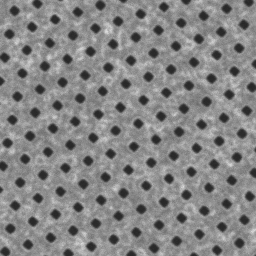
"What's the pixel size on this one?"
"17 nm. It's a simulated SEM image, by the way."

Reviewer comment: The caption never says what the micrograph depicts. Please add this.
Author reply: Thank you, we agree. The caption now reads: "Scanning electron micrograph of a regular array of holes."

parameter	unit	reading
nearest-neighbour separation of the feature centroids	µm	0.399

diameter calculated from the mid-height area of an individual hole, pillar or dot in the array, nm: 179